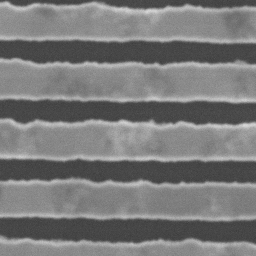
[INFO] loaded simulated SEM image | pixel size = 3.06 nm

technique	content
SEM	lines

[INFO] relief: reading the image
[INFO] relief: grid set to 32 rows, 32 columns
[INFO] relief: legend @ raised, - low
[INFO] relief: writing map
@---@@----@@--------------------
@@@@@@@@@@@@@@@@@@@@@@@@@@@@@@@@
@@@@@@@@@@@@@@@@@@@@@@@@@@@@@@@@
@@@@@@@@@@@@@@@@@@@@@@@@@@@@@@@@
@@@@@@@@@@@@@@@@@@@@@@@@@@@@@@@@
--------------------------------
--------------------------------
@@@-----------------------------
@@@@@@@@@@@@@@@@@@@@@@@@@@@@@@@@
@@@@@@@@@@@@@@@@@@@@@@@@@@@@@@@@
@@@@@@@@@@@@@@@@@@@@@@@@@@@@@@@@
@@@@@@@@@@@@@@@@@@@@@@@@@@@@@@@@
----@---@@@@@@@@@@@@@@@@@@@@@@@@
--------------------------------
--------------------------------
@@-@@@@@@@@@@@@@@@@---@@-------@
@@@@@@@@@@@@@@@@@@@@@@@@@@@@@@@@
@@@@@@@@@@@@@@@@@@@@@@@@@@@@@@@@
@@@@@@@@@@@@@@@@@@@@@@@@@@@@@@@@
@@@@@@@@@@@@@@@@@@@@@@@@@@@@@@@@
--------------------------------
--------------------------------
--------@-@---------------------
@@@@@@@@@@@@@@@@@@@@@@@@@@@@@@@@
@@@@@@@@@@@@@@@@@@@@@@@@@@@@@@@@
@@@@@@@@@@@@@@@@@@@@@@@@@@@@@@@@
@@@@@@@@@@@@@@@@@@@@@@@@@@@@@@@@
-------------------------@@@@@--
--------------------------------
--------------------------------
@@@@@@@@@@@@@@@@@@@@@@@@@@@@@@@@
@@@@@@@@@@@@@@@@@@@@@@@@@@@@@@@@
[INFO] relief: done